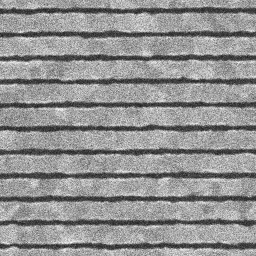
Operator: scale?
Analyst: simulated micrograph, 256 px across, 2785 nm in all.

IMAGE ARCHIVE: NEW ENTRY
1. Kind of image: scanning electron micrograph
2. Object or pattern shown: parallel lines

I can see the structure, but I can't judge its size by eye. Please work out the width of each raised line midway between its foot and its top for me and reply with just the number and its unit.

188 nanometers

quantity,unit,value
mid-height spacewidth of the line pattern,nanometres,62.6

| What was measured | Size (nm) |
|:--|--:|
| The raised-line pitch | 256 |